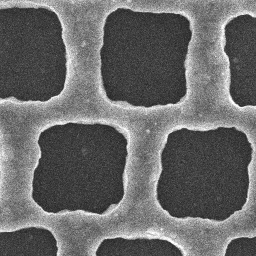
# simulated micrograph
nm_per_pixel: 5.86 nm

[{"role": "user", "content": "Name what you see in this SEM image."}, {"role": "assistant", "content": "holes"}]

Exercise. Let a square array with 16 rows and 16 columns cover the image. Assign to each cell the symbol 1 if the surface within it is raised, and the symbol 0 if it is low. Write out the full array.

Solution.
0001111111111111
0000111000001100
0000110000001100
0000110000001100
0000110000001100
0000110000001100
1111111000011110
1111111111111111
1110000011100001
1110000011000000
1100000011000000
1100000011000000
1100000011000001
1111111111100011
0001111111111111
0000110000011100